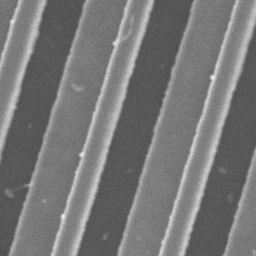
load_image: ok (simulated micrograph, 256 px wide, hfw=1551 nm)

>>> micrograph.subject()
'lines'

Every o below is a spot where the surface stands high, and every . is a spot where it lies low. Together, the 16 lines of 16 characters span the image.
ooo..oooo...oooo
oo...oooo...oooo
oo...oooo..ooooo
oo..ooooo..oooo.
oo..oooo...oooo.
o...oooo...oooo.
o..ooooo..oooo..
o..oooo...oooo..
...oooo...oooo..
...oooo..oooo...
..oooo...oooo...
..oooo...oooo..o
..oooo..ooooo..o
.oooo...oooo...o
.oooo...oooo..oo
.oooo...oooo..oo